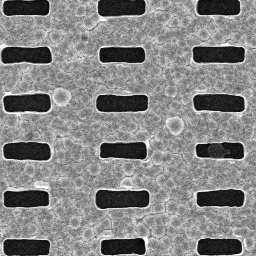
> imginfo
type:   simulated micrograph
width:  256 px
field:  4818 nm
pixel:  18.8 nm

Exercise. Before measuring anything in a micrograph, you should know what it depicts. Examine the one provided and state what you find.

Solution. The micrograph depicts a regular array of holes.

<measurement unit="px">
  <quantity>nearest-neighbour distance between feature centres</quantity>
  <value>47.7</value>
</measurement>